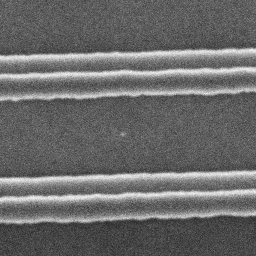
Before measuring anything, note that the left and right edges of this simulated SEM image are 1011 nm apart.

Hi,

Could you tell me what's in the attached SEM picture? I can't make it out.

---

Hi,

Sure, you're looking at lines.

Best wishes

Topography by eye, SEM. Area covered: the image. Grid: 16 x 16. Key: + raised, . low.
................
................
................
.+++++++++++++++
++++++++++++++++
++++++++++++++++
................
................
................
................
................
++++++++++++++++
++++++++++++++++
+++++++++++++...
................
................